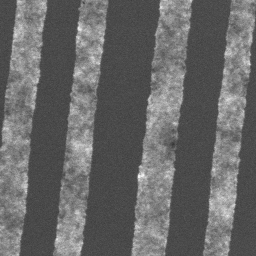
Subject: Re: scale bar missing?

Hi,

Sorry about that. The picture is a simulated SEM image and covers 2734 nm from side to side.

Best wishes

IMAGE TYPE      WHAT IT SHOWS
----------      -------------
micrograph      one or a few lines or trenches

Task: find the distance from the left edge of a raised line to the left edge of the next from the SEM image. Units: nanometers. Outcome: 766